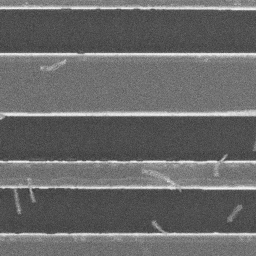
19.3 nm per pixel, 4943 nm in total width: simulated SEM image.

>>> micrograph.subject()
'lines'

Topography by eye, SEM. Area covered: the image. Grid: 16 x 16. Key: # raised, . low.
...............#
................
................
################
################
################
################
................
................
................
################
################
................
................
................
################